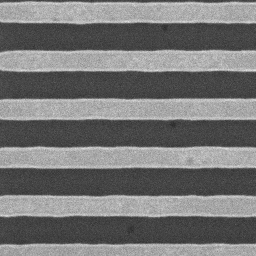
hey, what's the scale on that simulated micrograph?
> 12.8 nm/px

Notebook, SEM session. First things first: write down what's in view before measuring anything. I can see wiring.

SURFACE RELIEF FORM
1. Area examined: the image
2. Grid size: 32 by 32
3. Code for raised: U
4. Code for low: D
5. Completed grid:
UUUUUUUUUUUUUUUUUUUUUUUUUUUUUUUU
UUUUUUUUUUUUUUUUUUUUUUUUUUUUUUUU
UUUUUUUUUUUUUUUUUUUUUUUUUUUUUUUU
DDDDDDDDDDDDDDDDDDDDDDDDDDDDDDDD
DDDDDDDDDDDDDDDDDDDDDDDDDDDDDDDD
DDDDDDDDDDDDDDDDDDDDDDDDDDDDDDDD
UUUUUUUUUUUUUUUUUUUUUUUUUUUUUUUU
UUUUUUUUUUUUUUUUUUUUUUUUUUUUUUUU
UUUUUUUUUUUUUUUUUUUUUUUUUUUUUUUU
DDDDDDDDDDDDDDDDDDDDDDDDDDDDDDDD
DDDDDDDDDDDDDDDDDDDDDDDDDDDDDDDD
DDDDDDDDDDDDDDDDDDDDDDDDDDDDDDDD
UUUUUUUUUUUUUUUUUUUUUUUUUUUUUUUU
UUUUUUUUUUUUUUUUUUUUUUUUUUUUUUUU
UUUUUUUUUUUUUUUUUUUUUUUUUUUUUUUU
DDDDDDDDDDDDDDDDDDDDDDDDDDDDDDDD
DDDDDDDDDDDDDDDDDDDDDDDDDDDDDDDD
DDDDDDDDDDDDDDDDDDDDDDDDDDDDDDDD
DDDDUUDDDDDUUDUUUDDDDDDDUUUUDDDD
UUUUUUUUUUUUUUUUUUUUUUUUUUUUUUUU
UUUUUUUUUUUUUUUUUUUUUUUUUUUUUUUU
DDDDDDDDDDDDDDDDDDDDDDDDDDDDDDDD
DDDDDDDDDDDDDDDDDDDDDDDDDDDDDDDD
DDDDDDDDDDDDDDDDDDDDDDDDDDDDDDDD
UUUUUUUDDDDDDUUUDDDDDDDUUDUUUUUD
UUUUUUUUUUUUUUUUUUUUUUUUUUUUUUUU
UUUUUUUUUUUUUUUUUUUUUUUUUUUUUUUU
DDDDDDDDDDDDDDDDDDDDDDDDDDDDDDDD
DDDDDDDDDDDDDDDDDDDDDDDDDDDDDDDD
DDDDDDDDDDDDDDDDDDDDDDDDDDDDDDDD
DDDDDDDDDDDDDDDDDDDDDDDDDDDDDDDD
UUUUUUUUUUUUUUUUUUUUUUUUUUUUUUUU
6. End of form